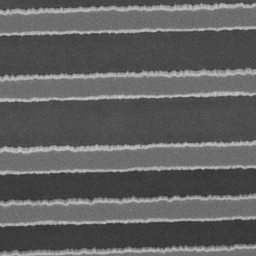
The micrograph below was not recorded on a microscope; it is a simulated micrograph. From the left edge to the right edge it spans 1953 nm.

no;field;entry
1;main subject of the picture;lines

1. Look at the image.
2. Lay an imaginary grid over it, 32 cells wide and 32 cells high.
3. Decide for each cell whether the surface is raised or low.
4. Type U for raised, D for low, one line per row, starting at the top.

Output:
DDDDDDDDDDDDDDDDDDDDDDDDDDDDDDDD
UUUUUUUUUUUUUUUUUUUUUUUUUUUUUUUU
UUUUUUUUUUUUUUUUUUUUUUUUUUUUUUUU
UUUUUUUUUUUUUUUUUUUUUUUUUUUUUUUU
DDDDDDDDDDDDDDDDDDDDDDDDDDDDDDDD
DDDDDDDDDDDDDDDDDDDDDDDDDDDDDDDD
DDDDDDDDDDDDDDDDDDDDDDDDDDDDDDDD
DDDDDDDDDDDDDDDDDDDDDDDDDDDDDDDD
DDDDDDDDDDDDDDDDDDDDDDDDDDDDDDDD
DDDDDDUUUUUUUUUUUUUUUUUUUUUUUUUU
UUUUUUUUUUUUUUUUUUUUUUUUUUUUUUUU
UUUUUUUUUUUUUUUUUUUUUUUUUUUUUUUU
UUUUUUDDDDDDDDDDDDDDDDDDDDDDDDDD
DDDDDDDDDDDDDDDDDDDDDDDDDDDDDDDD
DDDDDDDDDDDDDDDDDDDDDDDDDDDDDDDD
DDDDDDDDDDDDDDDDDDDDDDDDDDDDDDDD
DDDDDDDDDDDDDDDDDDDDDDDDDDDDDDDD
DDDDDDDDDDDDDDDDDDDDDDDDDDDDDDDD
DDDDDDUUUDUUUUUUUUUUUUUUUUUUUUUU
UUUUUUUUUUUUUUUUUUUUUUUUUUUUUUUU
UUUUUUUUUUUUUUUUUUUUUUUUUUUUUUUU
UUUUUUUUUUUDDDDDDDDDDDDDDDDDDDDD
DDDDDDDDDDDDDDDDDDDDDDDDDDDDDDDD
DDDDDDDDDDDDDDDDDDDDDDDDDDDDDDDD
DDDDDDDDDDDDDDDDDDDDDDDDDDDDDDUU
UUUUUUUUUUUUUUUUUUUUUUUUUUUUUUUU
UUUUUUUUUUUUUUUUUUUUUUUUUUUUUUUU
UUUUUUUUUUUUUUUUUUUUUUUUUUUUDDDD
DDDDDDDDDDDDDDDDDDDDDDDDDDDDDDDD
DDDDDDDDDDDDDDDDDDDDDDDDDDDDDDDD
DDDDDDDDDDDDDDDDDDDDDDDDDDDDDDDD
DDDDUUUUUUUUUUUUUUUUUUUUUUUUUUUU